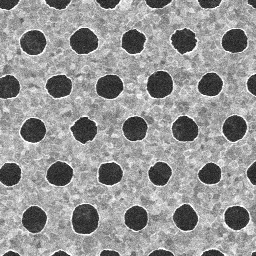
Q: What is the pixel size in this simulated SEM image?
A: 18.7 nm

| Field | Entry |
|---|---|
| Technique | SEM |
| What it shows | a regular array of holes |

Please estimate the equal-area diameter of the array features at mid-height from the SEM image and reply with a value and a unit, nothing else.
486 nanometres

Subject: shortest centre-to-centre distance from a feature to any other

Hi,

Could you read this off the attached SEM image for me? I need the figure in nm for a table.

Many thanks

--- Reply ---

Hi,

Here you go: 936